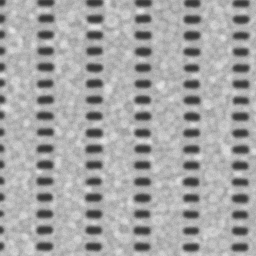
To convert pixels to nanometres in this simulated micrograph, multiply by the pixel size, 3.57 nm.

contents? a regular array of holes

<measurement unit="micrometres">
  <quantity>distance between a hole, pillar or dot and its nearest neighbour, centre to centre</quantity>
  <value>0.0572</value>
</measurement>